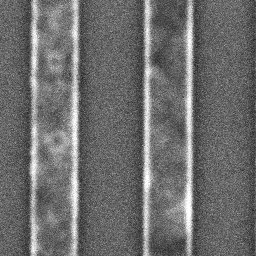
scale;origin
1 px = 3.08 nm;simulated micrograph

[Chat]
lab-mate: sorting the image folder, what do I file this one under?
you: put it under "one or a few lines or trenches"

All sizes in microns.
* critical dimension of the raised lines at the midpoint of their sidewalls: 0.136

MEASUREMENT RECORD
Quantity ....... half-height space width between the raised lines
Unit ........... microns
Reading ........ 0.213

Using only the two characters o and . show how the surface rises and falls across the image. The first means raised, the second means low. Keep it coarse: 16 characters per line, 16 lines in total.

..ooo....ooo....
..ooo....ooo....
..ooo....ooo....
..ooo....ooo....
..ooo....ooo....
..ooo....ooo....
..ooo....ooo....
..ooo....ooo....
..ooo....ooo....
..ooo....ooo....
..ooo....ooo....
..ooo....ooo....
..ooo....ooo....
..ooo....ooo....
..ooo....ooo....
..ooo....ooo....